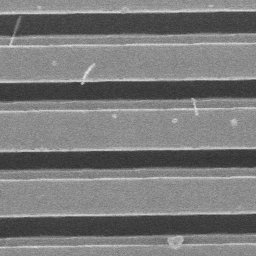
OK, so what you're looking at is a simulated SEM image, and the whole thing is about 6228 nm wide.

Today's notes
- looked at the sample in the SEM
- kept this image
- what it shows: lines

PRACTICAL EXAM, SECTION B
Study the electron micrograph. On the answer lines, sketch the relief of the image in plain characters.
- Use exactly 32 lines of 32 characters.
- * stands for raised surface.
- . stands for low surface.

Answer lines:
********************************
*****************...............
................................
................................
.....................***********
********************************
********************************
********************************
********************************
********************************
................................
................................
................................
********************************
********************************
********************************
********************************
********************************
********************************
................................
................................
.*******************************
********************************
********************************
********************************
********************************
********************************
................................
................................
...............................*
********************************
********************************